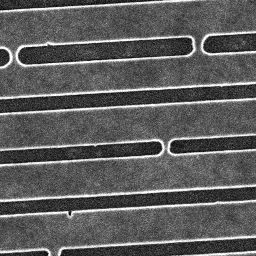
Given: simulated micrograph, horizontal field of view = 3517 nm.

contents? parallel lines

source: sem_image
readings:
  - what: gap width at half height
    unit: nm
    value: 209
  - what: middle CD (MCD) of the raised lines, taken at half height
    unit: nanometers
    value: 494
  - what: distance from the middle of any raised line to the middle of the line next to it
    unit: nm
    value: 699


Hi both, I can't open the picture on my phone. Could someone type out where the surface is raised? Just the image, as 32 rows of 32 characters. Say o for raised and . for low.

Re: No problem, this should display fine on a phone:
...............ooooooooooooooooo
oooooooooooooooooooooooooooooooo
oooooooooooooooooooooooooooooooo
oooooooooooooooooooooooooooooooo
oooooooooooooooooooooooooo......
oooooooo................o.......
.o......................oo.....o
.o.............ooooooooooooooooo
oooooooooooooooooooooooooooooooo
oooooooooooooooooooooooooooooooo
ooooooooooooooooooooooooooooo...
ooooooooooooo...................
.............................ooo
............oooooooooooooooooooo
oooooooooooooooooooooooooooooooo
oooooooooooooooooooooooooooooooo
oooooooooooooooooooooooooooooooo
oooooooooooooooooooooo..........
oooo................o...........
...................ooooooooooooo
...ooooooooooooooooooooooooooooo
oooooooooooooooooooooooooooooooo
oooooooooooooooooooooooooooooooo
oooooooooooooooooooooooooo......
oooooooooooo....................
..........................oooooo
..........oooooooooooooooooooooo
oooooooooooooooooooooooooooooooo
oooooooooooooooooooooooooooooooo
oooooooooooooooooooooooooooooooo
ooooooooooooooooo...............
......oo.......................o